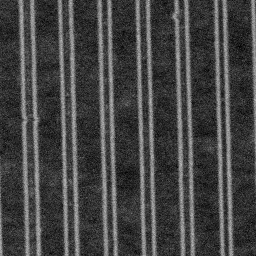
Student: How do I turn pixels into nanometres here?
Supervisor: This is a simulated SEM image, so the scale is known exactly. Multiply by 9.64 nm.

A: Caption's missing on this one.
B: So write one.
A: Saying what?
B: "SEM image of parallel lines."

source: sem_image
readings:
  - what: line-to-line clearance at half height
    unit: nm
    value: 273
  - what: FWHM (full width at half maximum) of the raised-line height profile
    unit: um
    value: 0.0999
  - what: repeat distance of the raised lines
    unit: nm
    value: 373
